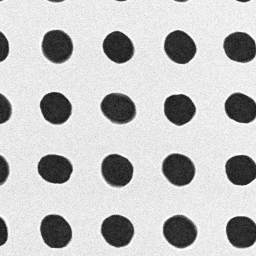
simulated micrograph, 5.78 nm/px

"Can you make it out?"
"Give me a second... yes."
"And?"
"a regular array of holes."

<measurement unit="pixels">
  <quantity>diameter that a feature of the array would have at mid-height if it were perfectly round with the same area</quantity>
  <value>32.3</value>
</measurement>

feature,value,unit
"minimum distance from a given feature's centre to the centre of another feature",0.352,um